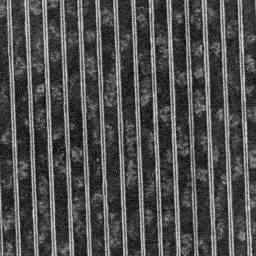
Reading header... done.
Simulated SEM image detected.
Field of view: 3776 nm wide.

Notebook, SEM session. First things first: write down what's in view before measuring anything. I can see parallel lines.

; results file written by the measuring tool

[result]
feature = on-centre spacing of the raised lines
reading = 17.7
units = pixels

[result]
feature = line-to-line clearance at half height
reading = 219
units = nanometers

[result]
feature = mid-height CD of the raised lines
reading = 42.4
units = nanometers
